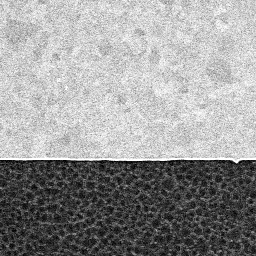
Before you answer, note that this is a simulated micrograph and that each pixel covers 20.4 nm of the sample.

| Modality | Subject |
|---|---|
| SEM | one or a few lines or trenches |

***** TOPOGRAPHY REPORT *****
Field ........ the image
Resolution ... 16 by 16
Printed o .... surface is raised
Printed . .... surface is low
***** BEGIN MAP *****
oooooooooooooooo
oooooooooooooooo
oooooooooooooooo
oooooooooooooooo
oooooooooooooooo
oooooooooooooooo
oooooooooooooooo
oooooooooooooooo
oooooooooooooooo
oooooooooooooooo
................
................
................
................
................
................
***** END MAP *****